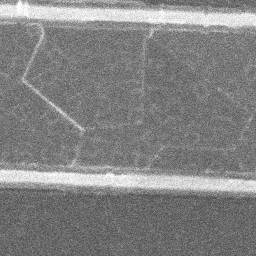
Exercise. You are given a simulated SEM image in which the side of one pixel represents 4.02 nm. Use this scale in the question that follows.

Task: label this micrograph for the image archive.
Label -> one or a few lines or trenches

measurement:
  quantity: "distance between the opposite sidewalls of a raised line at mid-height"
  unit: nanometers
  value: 664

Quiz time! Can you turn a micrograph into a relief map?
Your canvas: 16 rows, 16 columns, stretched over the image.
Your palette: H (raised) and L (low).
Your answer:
LLLLLLLLLLLLLLLL
HHHHHHHHHHHHHHHH
HHHHHHHHHHHHHHHH
HHHHHHHHHHHHHHHH
HHHHHHHHHHHHHHHH
HHHHHHHHHHHHHHHH
HHHHHHHHHHHHHHHH
HHHHHHHHHHHHHHHH
HHHHHHHHHHHHHHHH
HHHHHHHHHHHHHHHH
HHHHHHHHHHHHHHHH
LLLLLLLLLLLLLHHH
LLLLLLLLLLLLLLLL
LLLLLLLLLLLLLLLL
LLLLLLLLLLLLLLLL
LLLLLLLLLLLLLLLL